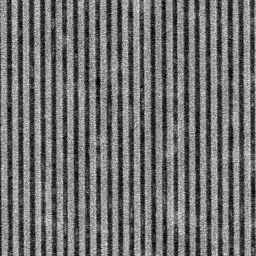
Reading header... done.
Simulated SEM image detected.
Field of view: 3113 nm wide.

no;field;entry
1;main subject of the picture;parallel lines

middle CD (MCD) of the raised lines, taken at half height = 65.3 nanometers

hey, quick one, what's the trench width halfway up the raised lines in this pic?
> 0.0653 micrometres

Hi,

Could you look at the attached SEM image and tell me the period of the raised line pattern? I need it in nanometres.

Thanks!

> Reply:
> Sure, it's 134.